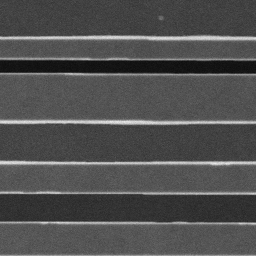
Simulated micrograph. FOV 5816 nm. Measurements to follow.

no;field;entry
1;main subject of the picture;lines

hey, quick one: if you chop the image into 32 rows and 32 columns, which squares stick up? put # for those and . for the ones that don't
................................
................................
................................
................................
................................
################################
################################
................................
................................
################################
################################
################################
################################
################################
################################
................................
................................
................................
................................
................................
################################
################################
################################
################################
................................
................................
................................
................................
################################
################################
################################
################################